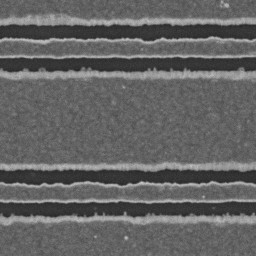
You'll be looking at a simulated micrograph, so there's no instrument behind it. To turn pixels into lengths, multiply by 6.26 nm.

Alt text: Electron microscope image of lines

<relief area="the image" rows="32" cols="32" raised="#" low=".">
################################
################################
################################
................................
................................
################################
################################
................................
................................
################################
################################
################################
################################
################################
################################
################################
################################
################################
################################
################################
################################
................................
................................
################################
################################
................................
................................
################################
################################
################################
################################
################################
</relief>